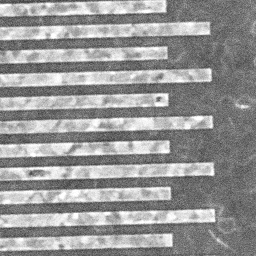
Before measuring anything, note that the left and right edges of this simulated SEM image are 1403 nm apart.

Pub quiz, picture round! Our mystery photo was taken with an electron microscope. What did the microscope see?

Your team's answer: parallel lines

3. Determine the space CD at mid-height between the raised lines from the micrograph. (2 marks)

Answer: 64.4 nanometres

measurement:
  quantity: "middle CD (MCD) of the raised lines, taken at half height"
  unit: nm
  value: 64.4